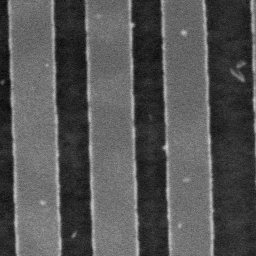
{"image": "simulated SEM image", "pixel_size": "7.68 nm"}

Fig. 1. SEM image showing lines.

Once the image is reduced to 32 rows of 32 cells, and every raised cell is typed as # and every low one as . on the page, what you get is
.######....#####....######.....#
.######....#####....######.....#
.######....#####....######......
.######....#####....######......
.######....#####....######......
.######....#####....######......
.######....#####....######......
.######....######...######......
.######....######...######......
.######....######....#####......
.######....######....#####......
.######....######....#####......
.######....######....#####......
.######....######....#####......
..#####....######....#####......
..#####....######....#####......
..#####....######....#####......
..#####....######....#####......
..#####....######....#####......
..#####....######....#####......
..#####....######....#####......
..#####....######....#####......
..#####....######....#####......
..#####....######....#####......
..#####....######....#####......
..#####....######....#####......
..#####....######....######.....
..#####....######....######.....
..#####.....#####....######.....
..######....#####....######.....
..######....#####....######.....
..######....#####....######.....